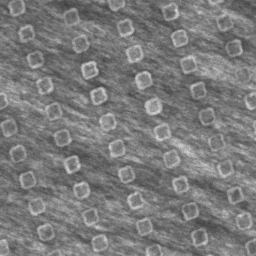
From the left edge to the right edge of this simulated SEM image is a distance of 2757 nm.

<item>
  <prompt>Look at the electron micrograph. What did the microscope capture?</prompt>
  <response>a regular array of raised bodies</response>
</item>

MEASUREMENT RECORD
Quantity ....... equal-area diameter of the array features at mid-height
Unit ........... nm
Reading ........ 172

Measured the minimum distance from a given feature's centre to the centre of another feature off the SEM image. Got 298 nm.